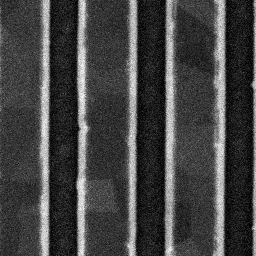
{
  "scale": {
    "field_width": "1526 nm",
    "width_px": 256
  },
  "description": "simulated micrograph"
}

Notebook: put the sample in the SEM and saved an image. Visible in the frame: one or a few lines or trenches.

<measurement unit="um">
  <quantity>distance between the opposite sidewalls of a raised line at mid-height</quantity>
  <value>0.309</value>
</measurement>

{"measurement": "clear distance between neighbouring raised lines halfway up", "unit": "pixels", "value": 36.2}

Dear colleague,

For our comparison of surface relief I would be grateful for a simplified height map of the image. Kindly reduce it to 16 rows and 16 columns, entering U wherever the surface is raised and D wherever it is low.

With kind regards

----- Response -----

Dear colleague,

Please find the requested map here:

UUUDDUUUDDDUUUDD
UUUDDUUUDDDUUUDD
UUUDDUUUDDDUUUDD
UUUDDUUUDDDUUUDD
UUUDDUUUDDDUUUDD
UUUDDUUUDDDUUUDD
UUUDDUUUDDDUUUDD
UUUDDUUUDDDUUUDD
UUUDDUUUDDDUUUDD
UUUDDUUUDDDUUUDD
UUUDDUUUDDDUUUDD
UUUDDUUUDDDUUUDD
UUUDDUUUDDDUUUDD
UUUDDUUUDDDUUUDD
UUUDDUUUDDDUUUDD
UUUDDUUUDDDUUUDD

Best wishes